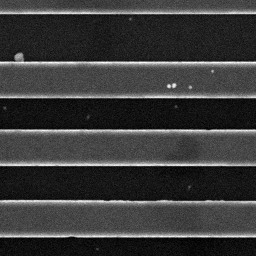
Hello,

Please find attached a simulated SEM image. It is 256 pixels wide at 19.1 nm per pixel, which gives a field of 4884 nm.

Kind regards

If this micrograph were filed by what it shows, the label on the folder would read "lines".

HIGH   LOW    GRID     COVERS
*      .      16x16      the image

****************
................
................
................
****************
****************
................
................
****************
****************
................
................
................
****************
****************
................